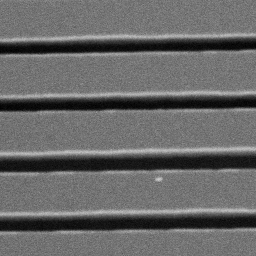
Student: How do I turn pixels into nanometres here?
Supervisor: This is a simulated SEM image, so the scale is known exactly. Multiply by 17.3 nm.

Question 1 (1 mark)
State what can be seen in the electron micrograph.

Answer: lines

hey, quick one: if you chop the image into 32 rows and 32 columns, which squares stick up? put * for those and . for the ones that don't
********************************
********************************
********************************
********************************
********************************
................................
.........................*******
********************************
********************************
********************************
********************************
********************************
................................
................................
********************************
********************************
********************************
********************************
********************************
*******.........................
................................
............********************
********************************
********************************
********************************
********************************
********************************
................................
................................
********************************
********************************
********************************